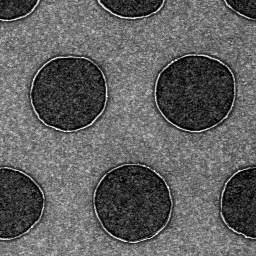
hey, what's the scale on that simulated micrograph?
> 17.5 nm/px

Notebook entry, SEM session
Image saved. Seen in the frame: raised bodies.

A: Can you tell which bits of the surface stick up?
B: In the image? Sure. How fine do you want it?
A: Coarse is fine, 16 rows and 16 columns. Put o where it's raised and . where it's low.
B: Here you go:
oo.....ooo.....o
................
................
............o...
..oooo....oooo..
..ooooo...ooooo.
..ooooo...ooooo.
...ooo.....ooo..
................
................
.......oo.......
oo....oooo....oo
ooo...ooooo...oo
ooo...ooooo...oo
oo.....ooo.....o
................